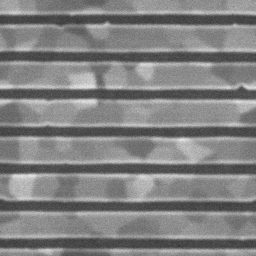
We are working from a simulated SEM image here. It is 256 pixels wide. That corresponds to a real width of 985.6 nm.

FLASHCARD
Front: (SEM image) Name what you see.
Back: parallel lines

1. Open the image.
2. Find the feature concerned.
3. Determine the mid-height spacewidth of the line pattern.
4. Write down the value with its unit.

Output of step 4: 44.7 nm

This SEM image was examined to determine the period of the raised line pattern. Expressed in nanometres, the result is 144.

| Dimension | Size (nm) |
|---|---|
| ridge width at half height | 100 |